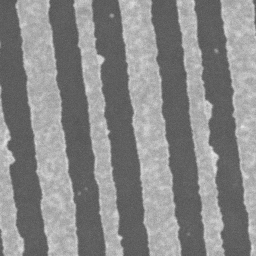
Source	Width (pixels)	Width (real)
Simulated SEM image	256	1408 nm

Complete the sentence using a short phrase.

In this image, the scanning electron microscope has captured lines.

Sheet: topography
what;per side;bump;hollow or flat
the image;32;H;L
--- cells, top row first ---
LLHHHHLLLHHLLLLHHHHLLLHHLLLLHHHH
LLHHHHLLLHHLLLLHHHHLLLHHLLLLHHHH
LLHHHHLLLLHHLLLHHHHLLLHHLLLLHHHH
LLLHHHLLLLHHLLLHHHHLLLLHLLLLHHHH
LLLHHHLLLLHHLLLHHHHLLLLHHLLLHHHH
LLLHHHHLLLHHLLLLHHHLLLLHHLLLHHHH
LLLHHHHLLLHHLLLLHHHHLLLHHLLLHHHH
LLLHHHHLLLHHHLLLHHHLLLLHHLLLLHHH
LLLHHHHLLLHHHLLLHHHHLLLHHLLLLHHH
LLLHHHHLLLHHHLLLHHHHLLLHHLLLLHHH
LLLHHHHLLLLHHLLLHHHHLLLHHLLLLHHH
LLLHHHHLLLLHHLLLHHHHLLLHHHLLLHHH
LLLLHHHHLLLHHLLLHHHHLLLLHHLLLHHH
LLLLHHHHLLLHHLLLLHHHLLLLHHLLLHHH
LLLLHHHHLLLHHLLLLHHHLLLLHHLLLHHH
HLLLHHHHLLLHHLLLLHHHHLLLHHLLLLHH
HLLLHHHHLLLHHLLLLHHHHLLLHHLLLLHH
HLLLHHHHLLLHHHLLLHHHHLLLHHLLLLHH
HLLLHHHHLLLLHHLLLHHHHLLLHHLLLLHH
HLLLLHHHLLLLHHLLLHHHHLLLLHHLLLHH
HLLLLHHHLLLLHHLLLLHHHLLLLHHLLLHH
HLLLLHHHLLLLHHLLLLHHHLLLLHHLLLHH
HLLLLHHHHLLLHHLLLLHHHLLLLHHLLLHH
HHLLLHHHHLLLHHLLLLHHHLLLLHHLLLLH
HHLLLHHHHLLLLHLLLLHHHHLLLHHLLLLH
HHLLLHHHHLLLLHLLLLHHHHLLLHHLLLLH
HHLLLHHHHLLLLHHLLLHHHHLLLHHHLLLH
HHLLLLHHHLLLLHHLLLHHHHLLLHHHLLLH
HHLLLLHHHLLLLHHLLLHHHHLLLLHHLLLH
HHLLLLHHHLLLLHHLLLLHHHLLLLHHLLLH
HHHLLLHHHHLLLHHLLLLHHHLLLLHHLLLH
LHHLLLHHHHLLLHHLLLLHHHHLLLHHLLLH